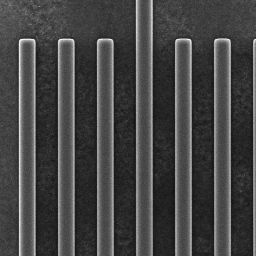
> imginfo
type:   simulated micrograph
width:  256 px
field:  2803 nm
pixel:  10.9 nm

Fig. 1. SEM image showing groups of lines, slits or small figures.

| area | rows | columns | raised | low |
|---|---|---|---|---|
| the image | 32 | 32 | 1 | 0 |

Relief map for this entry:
00000000000000000110000000000000
00000000000000000110000000000000
00000000000000000110000000000000
00000000000000000110000000000000
00000000000000000110000000000000
00110001100011000110001100011000
00110001100011000110001100011000
00110001100011000110001100011000
00110001100011000110001100011000
00110001100011000110001100011000
00110001100011000110001100011000
00110001100011000110001100011000
00110001100011000110001100011000
00110001100011000110001100011000
00110001100011000110001100011000
00110001100011000110001100011000
00110001100011000110001100011000
00110001100011000110001100011000
00110001100011000110001100011000
00110001100011000110001100011000
00110001100011000110001100011000
00110001100011000110001100011000
00110001100011000110001100011000
00110001100011000110001100011000
00110001100011000110001100011000
00110001100011000110001100011000
00110001100011000110001100011000
00110001100011000110001100011000
00110001100011000110001100011000
00110001100011000110001100011000
00110001100011000110001100011000
00110001100011000110001100011000